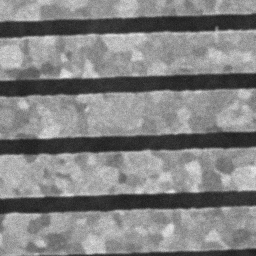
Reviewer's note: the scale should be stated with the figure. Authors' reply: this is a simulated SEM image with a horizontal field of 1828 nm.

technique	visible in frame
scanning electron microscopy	lines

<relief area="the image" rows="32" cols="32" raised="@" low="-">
@@@@@@@@@@@@@@@@@@@@@@@@@@@@@@@@
@@@@@@@@@@@@@@@@@@@@@@@@@@@@@@@@
@@@@@---------------------------
--------------------------------
---------@@@@@@@@@@@@@@@@@@@@@@@
@@@@@@@@@@@@@@@@@@@@@@@@@@@@@@@@
@@@@@@@@@@@@@@@@@@@@@@@@@@@@@@@@
@@@@@@@@@@@@@@@@@@@@@@@@@@@@@@@@
@@@@@@@@@@@@@@@@@@@@@@@@@@@@@@@@
@@@@@@@@@@@@@@@-----------------
--------------------------------
-------------------@@@@@@@@@@@@@
@@@@@@@@@@@@@@@@@@@@@@@@@@@@@@@@
@@@@@@@@@@@@@@@@@@@@@@@@@@@@@@@@
@@@@@@@@@@@@@@@@@@@@@@@@@@@@@@@@
@@@@@@@@@@@@@@@@@@@@@@@@@@@@@@@@
@@@@@@@@@@@@@@@@@@@@@@@@@@------
--------------------------------
--------------------------------
@@@@@@@@@@@@@@@@@@@@@@@@@@@@@@@@
@@@@@@@@@@@@@@@@@@@@@@@@@@@@@@@@
@@@@@@@@@@@@@@@@@@@@@@@@@@@@@@@@
@@@@@@@@@@@@@@@@@@@@@@@@@@@@@@@@
@@@@@@@@@@@@@@@@@@@@@@@@@@@@@@@@
@@@@@@--------------------------
--------------------------------
-----------@@@@@@@@@@@@@@@@@@@@@
@@@@@@@@@@@@@@@@@@@@@@@@@@@@@@@@
@@@@@@@@@@@@@@@@@@@@@@@@@@@@@@@@
@@@@@@@@@@@@@@@@@@@@@@@@@@@@@@@@
@@@@@@@@@@@@@@@@@@@@@@@@@@@@@@@@
@@@@@@@@@@@@@@@@@---------------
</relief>